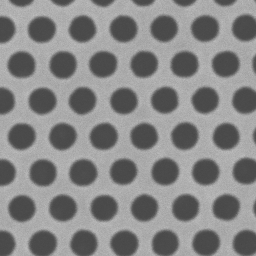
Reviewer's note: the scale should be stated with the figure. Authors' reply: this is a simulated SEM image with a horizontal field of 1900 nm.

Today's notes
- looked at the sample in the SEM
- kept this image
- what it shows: a regular array of holes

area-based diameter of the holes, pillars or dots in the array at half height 206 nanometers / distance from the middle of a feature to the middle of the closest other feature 300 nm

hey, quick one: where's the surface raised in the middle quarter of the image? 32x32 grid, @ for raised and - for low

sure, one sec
---@@@-------@@@--------@@------
---@@@@------@@@@------@@@@-----
---@@@@-----@@@@@-----@@@@@-----
-@@@@@@@@-@@@@@@@@@--@@@@@@@@@@@
@@@@@@@@@@@@@@@@@@@@@@@@@@@@@@@@
@@@@@@@@@@@@@@@@@@@@@@@@@@@@@@@@
@@@----@@@@@@----@@@@@@-----@@@@
@@------@@@@------@@@@------@@@@
@-------@@@-------@@@@-------@@@
@-------@@@--------@@@-------@@@
@-------@@@@------@@@@------@@@@
@@-----@@@@@------@@@@@-----@@@@
@@@---@@@@@@@@--@@@@@@@@--@@@@@@
@@@@@@@@@@@@@@@@@@@@@@@@@@@@@@@@
@@@@@@@@@@-@@@@@@@@@@@@@@@@@@@-@
--@@@@@@----@@@@@@----@@@@@@----
---@@@@------@@@@------@@@@-----
---@@@-------@@@-------@@@@-----
---@@@-------@@@--------@@@-----
---@@@@------@@@@------@@@@-----
--@@@@@------@@@@------@@@@@----
@@@@@@@@@--@@@@@@@@--@@@@@@@@--@
@@@@@@@@@@@@@@@@@@@@@@@@@@@@@@@@
@@@@@@@@@@@@@@@-@@@@@@@@---@@@@@
@@@----@@@@@-----@@@@@@-----@@@@
@@------@@@@------@@@@-------@@@
@-------@@@-------@@@@-------@@@
@--------@@-------@@@@-------@@@
@-------@@@@------@@@@-------@@@
@@------@@@@-----@@@@@@-----@@@@
@@@@--@@@@@@@@@@@@@@@@@@@@@@@@@@
@@@@@@@@@@@@@@@@@@@@@@@@@@@@@@@@